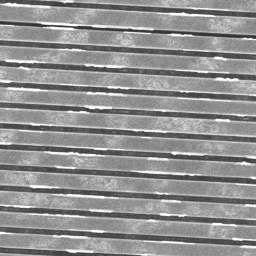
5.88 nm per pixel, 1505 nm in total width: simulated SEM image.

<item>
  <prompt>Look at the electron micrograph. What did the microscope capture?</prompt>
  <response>parallel lines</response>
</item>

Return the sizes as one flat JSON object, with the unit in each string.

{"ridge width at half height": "89.6 nm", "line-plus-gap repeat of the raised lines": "20.6 pixels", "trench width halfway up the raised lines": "0.0316 micrometres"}